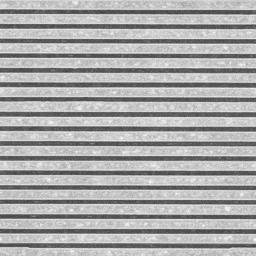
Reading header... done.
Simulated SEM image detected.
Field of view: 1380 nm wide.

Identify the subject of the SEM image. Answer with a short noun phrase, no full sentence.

parallel lines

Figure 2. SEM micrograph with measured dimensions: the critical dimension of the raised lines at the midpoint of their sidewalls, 0.0485 um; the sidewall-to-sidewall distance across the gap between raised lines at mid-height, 5.38 pixels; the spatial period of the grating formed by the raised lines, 78.7 nanometres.